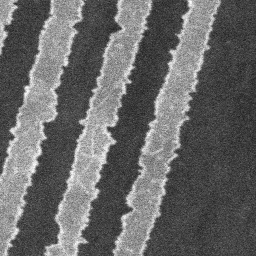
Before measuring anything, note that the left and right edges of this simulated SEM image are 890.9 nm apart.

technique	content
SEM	one or a few lines or trenches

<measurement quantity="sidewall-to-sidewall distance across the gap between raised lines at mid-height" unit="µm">0.131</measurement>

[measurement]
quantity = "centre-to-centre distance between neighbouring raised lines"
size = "226 nanometres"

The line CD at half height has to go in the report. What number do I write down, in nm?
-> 94.6